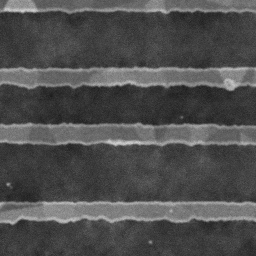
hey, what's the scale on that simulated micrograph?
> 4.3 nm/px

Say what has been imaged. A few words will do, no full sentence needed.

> lines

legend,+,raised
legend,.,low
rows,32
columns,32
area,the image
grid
++++++++++++++++++++++++++++++++
..+.....++..........+.......+..+
................................
................................
................................
................................
................................
................................
..+...+....++...+++.++.....+++++
++++++++++++++++++++++++++++++++
++++++++++++++++.+++++++++++++++
................................
................................
................................
................................
........+........+..............
++++++++++++++++++++++++++++++++
++++++++++++++++++++++++++++++++
................................
................................
................................
................................
................................
................................
................................
++++++++++++++++++++++++++++++++
++++++++++++++++++++++++++++++++
++..++.+++...++..+++.+++.++++..+
................................
................................
................................
................................